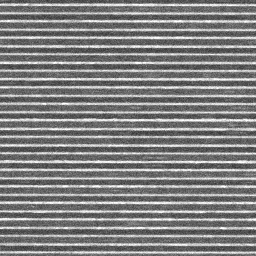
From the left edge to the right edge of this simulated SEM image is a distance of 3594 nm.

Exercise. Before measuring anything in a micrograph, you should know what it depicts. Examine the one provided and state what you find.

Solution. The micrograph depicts parallel lines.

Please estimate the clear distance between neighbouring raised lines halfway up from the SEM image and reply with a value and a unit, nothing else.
0.0895 micrometres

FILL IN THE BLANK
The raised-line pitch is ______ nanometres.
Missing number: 116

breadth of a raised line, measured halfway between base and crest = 26.3 nm